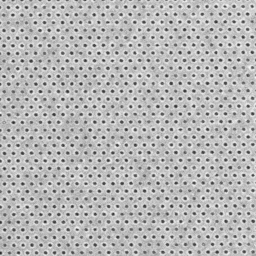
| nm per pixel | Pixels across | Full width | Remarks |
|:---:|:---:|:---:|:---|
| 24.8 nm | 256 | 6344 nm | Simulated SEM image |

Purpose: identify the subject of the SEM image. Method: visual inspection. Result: a regular array of holes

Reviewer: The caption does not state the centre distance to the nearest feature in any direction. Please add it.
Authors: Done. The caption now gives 216 nm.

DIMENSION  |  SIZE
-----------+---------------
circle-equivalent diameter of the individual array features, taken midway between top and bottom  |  101 nm